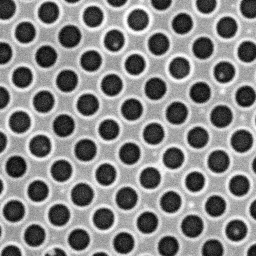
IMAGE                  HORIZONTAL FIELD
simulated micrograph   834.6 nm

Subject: a regular array of holes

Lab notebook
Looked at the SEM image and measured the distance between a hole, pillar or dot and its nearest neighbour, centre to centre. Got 0.101 microns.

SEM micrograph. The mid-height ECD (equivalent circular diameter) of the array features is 24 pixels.